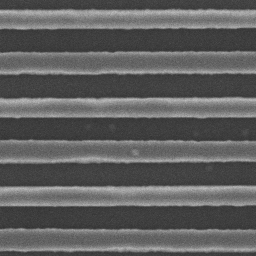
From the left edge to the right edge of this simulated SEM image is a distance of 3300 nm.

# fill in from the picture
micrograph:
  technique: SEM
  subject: lines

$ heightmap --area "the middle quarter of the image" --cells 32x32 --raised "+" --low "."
++++++++++++++++++++++++++++++++
++++++++++++++++++++++++++++++++
........+.......................
................................
................................
................................
................................
................................
................................
++++++++++++++++++++++++++++++++
++++++++++++++++++++++++++++++++
++++++++++++++++++++++++++++++++
++++++++++++++++++++++++++++++++
................................
................................
................................
................................
................................
................................
++++++++++++++++++++++++++++++++
++++++++++++++++++++++++++++++++
++++++++++++++++++++++++++++++++
++++++++++++++++++++++++++++++++
++++++++++++++++++++++++++++++++
...............+................
................................
................................
................................
................................
................................
................................
++++++++++++++++++++++++++++++++